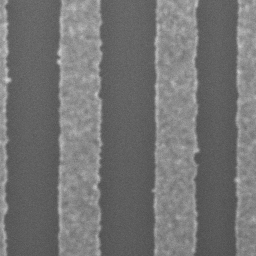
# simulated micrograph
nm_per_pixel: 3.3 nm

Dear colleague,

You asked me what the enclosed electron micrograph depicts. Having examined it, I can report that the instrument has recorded lines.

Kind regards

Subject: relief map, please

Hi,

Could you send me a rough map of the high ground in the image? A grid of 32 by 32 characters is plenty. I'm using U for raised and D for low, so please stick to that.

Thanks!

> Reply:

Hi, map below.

UDDDDDDDUUUUDDDDDDDDUUUUUDDDDDUU
UDDDDDDDUUUUDDDDDDDDUUUUDDDDDDUU
UDDDDDDDUUUUUDDDDDDDUUUUDDDDDDUU
UDDDDDDDUUUUDDDDDDDDUUUUUDDDDDUU
UDDDDDDDUUUUDDDDDDDDUUUUUDDDDDUU
UDDDDDDUUUUUUDDDDDDUUUUUUDDDDDUU
UDDDDDDUUUUUUDDDDDDDUUUUDDDDDDUU
UDDDDDDDUUUUUDDDDDDUUUUUDDDDDDUU
UDDDDDDDUUUUDDDDDDDDUUUUDDDDDDUU
UDDDDDDDUUUUDDDDDDDDUUUUDDDDDDUU
UDDDDDDUUUUUDDDDDDDDUUUUUDDDDDUU
UDDDDDDUUUUUDDDDDDDDUUUUDDDDDDUU
UDDDDDDDUUUUDDDDDDDDUUUUDDDDDDUU
UDDDDDDUUUUUUDDDDDDDUUUUUDDDDDUU
UDDDDDDDUUUUUDDDDDDDUUUUDDDDDDUU
UDDDDDDDUUUUUDDDDDDDUUUUDDDDDDUU
UDDDDDDDUUUUDDDDDDDDUUUUDDDDDDUU
UDDDDDDUUUUUUDDDDDDDUUUUDDDDDDUU
UDDDDDDDUUUUUDDDDDDDUUUUDDDDDDUU
UDDDDDDDUUUUDDDDDDDUUUUUDDDDDDUU
UDDDDDDUUUUUDDDDDDDDUUUUDDDDDDUU
UDDDDDDUUUUUDDDDDDDDUUUUDDDDDDUU
UDDDDDDUUUUUDDDDDDDDUUUUDDDDDDUU
UDDDDDDUUUUUDDDDDDDUUUUUDDDDDDUU
UDDDDDDUUUUUDDDDDDDUUUUUDDDDDDUU
UDDDDDDUUUUUDDDDDDDUUUUUDDDDDDUU
UDDDDDDUUUUUDDDDDDDUUUUUUDDDDDUU
DDDDDDDUUUUUDDDDDDDDUUUUDDDDDUUU
UDDDDDDUUUUUDDDDDDDUUUUUDDDDDUUU
UDDDDDDUUUUUDDDDDDDUUUUUDDDDDDUU
UDDDDDDUUUUUDDDDDDDUUUUUDDDDDDUU
UDDDDDDUUUUUDDDDDDDUUUUUDDDDDDUU